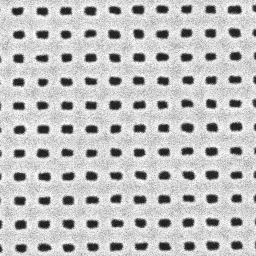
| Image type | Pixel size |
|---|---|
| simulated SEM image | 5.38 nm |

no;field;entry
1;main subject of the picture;a regular array of holes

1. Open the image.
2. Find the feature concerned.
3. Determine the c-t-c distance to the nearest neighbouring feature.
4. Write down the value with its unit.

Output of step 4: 125 nanometers